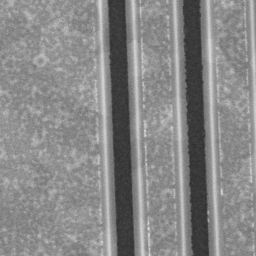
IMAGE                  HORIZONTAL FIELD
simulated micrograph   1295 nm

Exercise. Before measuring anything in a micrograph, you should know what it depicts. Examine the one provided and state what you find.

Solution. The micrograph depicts one or a few lines or trenches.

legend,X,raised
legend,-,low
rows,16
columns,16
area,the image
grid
XXXXXX--XXX--XXX
XXXXXX--XXX--XXX
XXXXXX--XXX--XXX
XXXXXX--XXX--XXX
XXXXXX---XX--XXX
XXXXXX---XX--XXX
XXXXXXX--XX--XXX
XXXXXXX--XX--XXX
XXXXXXX--XX--XXX
XXXXXXX--XX--XXX
XXXXXXX--XX--XXX
XXXXXXX--XX--XXX
XXXXXXX--XX--XXX
XXXXXXX--XX---XX
XXXXXXX--XX---XX
XXXXXXX--XXX--XX